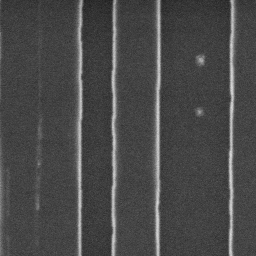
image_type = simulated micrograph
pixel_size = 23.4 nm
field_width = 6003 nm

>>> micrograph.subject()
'wiring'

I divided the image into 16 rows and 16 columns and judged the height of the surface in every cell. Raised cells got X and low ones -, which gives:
XXXXX--XXX----XX
XXXXX--XXX----XX
XXXXX--XXX----XX
XXXXX--XXX----XX
XXXXX--XXX----XX
XXXXX--XXX----XX
XXXXX--XXX----XX
XXXXX--XXX----XX
XXXXX--XXX----XX
XXXXX--XXX----XX
XXXXX--XXX----XX
XXXXX--XXX----XX
XXXXX--XXX----XX
XXXXX--XXX----XX
XXXXX--XXX----XX
XXXXX--XXX----XX